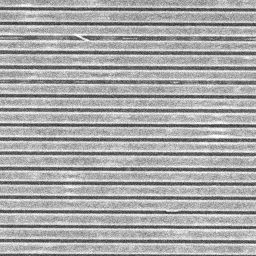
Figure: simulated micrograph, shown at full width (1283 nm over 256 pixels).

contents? parallel lines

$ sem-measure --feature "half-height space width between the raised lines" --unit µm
0.0188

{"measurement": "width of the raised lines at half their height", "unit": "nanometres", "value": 51.4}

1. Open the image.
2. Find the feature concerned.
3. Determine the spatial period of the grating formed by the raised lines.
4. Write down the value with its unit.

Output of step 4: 72.6 nm